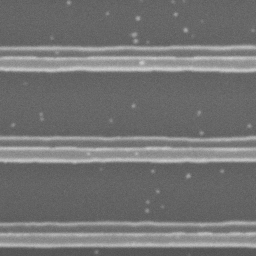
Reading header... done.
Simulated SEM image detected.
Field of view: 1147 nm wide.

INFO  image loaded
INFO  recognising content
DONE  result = lines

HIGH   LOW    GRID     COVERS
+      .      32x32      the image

................................
................................
................................
................................
................................
................................
++++++++++++++++++++++++++++++++
++++++++++++++++++++++++++++++++
++++++++++++++++++++++++++++++++
................................
................................
................................
................................
................................
................................
................................
................................
++++++++++++++++++++++++...+++++
++++++++++++++++++++++++++++++++
++++++++++++++++++++++++++++++++
................................
................................
................................
................................
................................
................................
................................
................................
++++++++++++++++++++++++++++++++
++++++++++++++++++++++++++++++++
++++++++++++++++++++++++++++++++
................................